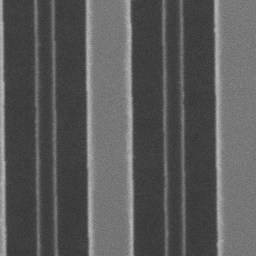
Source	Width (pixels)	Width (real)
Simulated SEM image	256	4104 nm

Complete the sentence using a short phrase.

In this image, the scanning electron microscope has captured lines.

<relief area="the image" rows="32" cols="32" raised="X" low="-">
-----XX----XXXXX-----XX----XXXXX
-----XX----XXXXX-----XX----XXXXX
-----XX----XXXXX-----XX----XXXXX
-----XX----XXXXX-----XX----XXXXX
-----XX----XXXXX-----XX----XXXXX
-----XX----XXXXX-----XX----XXXXX
-----XX----XXXXX-----XX----XXXXX
-----XX----XXXXX-----XX----XXXXX
-----XX----XXXXX-----XX----XXXXX
-----XX----XXXXX-----XX----XXXXX
-----XX----XXXXX-----XX----XXXXX
-----XX----XXXXX-----XX----XXXXX
-----XX----XXXXX-----XX----XXXXX
-----XX----XXXXX-----XX----XXXXX
-----XX----XXXXX-----XX----XXXXX
-----XX----XXXXX-----XX----XXXXX
-----XX----XXXXX-----XX----XXXXX
-----XX----XXXXX-----XX----XXXXX
-----XX----XXXXX-----XX----XXXXX
-----XX----XXXXX-----XX----XXXXX
-----XX----XXXXX-----XX----XXXXX
-----XX----XXXXX-----XX----XXXXX
-----XX----XXXXX-----XX----XXXXX
-----XX----XXXXX-----XX----XXXXX
-----XX----XXXXX-----XX----XXXXX
-----XX----XXXXX-----XX----XXXXX
-----XX----XXXXX-----XX----XXXXX
-----XX----XXXXX-----XX----XXXXX
-----XX----XXXXX-----XX----XXXXX
-----XX----XXXXX-----XX----XXXXX
-----XX----XXXXX-----XX----XXXXX
-----XX----XXXXX-----XX----XXXXX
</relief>